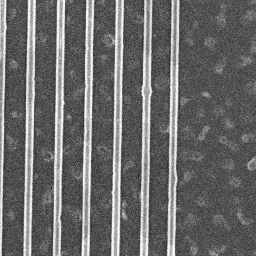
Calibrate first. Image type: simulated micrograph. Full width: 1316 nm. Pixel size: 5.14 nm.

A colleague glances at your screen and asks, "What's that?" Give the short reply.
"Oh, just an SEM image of parallel lines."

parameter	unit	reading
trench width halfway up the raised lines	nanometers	118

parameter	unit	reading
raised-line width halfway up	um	0.0308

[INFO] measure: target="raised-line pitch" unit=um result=0.148